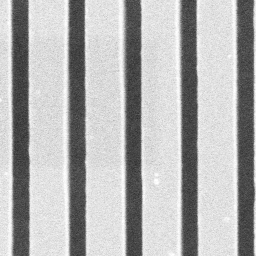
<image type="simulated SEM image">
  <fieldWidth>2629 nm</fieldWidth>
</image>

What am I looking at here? lines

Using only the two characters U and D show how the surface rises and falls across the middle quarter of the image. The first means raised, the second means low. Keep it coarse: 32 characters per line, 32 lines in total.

UDDDDUUUUUUUUUUDDDDDUUUUUUUUUDDD
UDDDDUUUUUUUUUUDDDDDUUUUUUUUUDDD
UDDDDUUUUUUUUUUDDDDDUUUUUUUUUDDD
UDDDDUUUUUUUUUUDDDDDUUUUUUUUUDDD
UDDDDUUUUUUUUUUDDDDDUUUUUUUUUDDD
UDDDDUUUUUUUUUUDDDDDUUUUUUUUUDDD
UDDDDUUUUUUUUUUDDDDDUUUUUUUUUDDD
UDDDDUUUUUUUUUUDDDDDUUUUUUUUUDDD
UDDDDUUUUUUUUUUDDDDDUUUUUUUUUDDD
UDDDDUUUUUUUUUUDDDDDUUUUUUUUUDDD
UDDDDUUUUUUUUUUDDDDDUUUUUUUUUDDD
UDDDDDUUUUUUUUUDDDDDUUUUUUUUUDDD
UDDDDUUUUUUUUUUDDDDDUUUUUUUUUDDD
UDDDDUUUUUUUUUUDDDDDUUUUUUUUUDDD
UDDDDUUUUUUUUUUDDDDDUUUUUUUUUDDD
UDDDDUUUUUUUUUUDDDDDUUUUUUUUUDDD
UDDDDUUUUUUUUUUDDDDDUUUUUUUUUDDD
UDDDDUUUUUUUUUUDDDDDUUUUUUUUUDDD
UDDDDUUUUUUUUUUDDDDDUUUUUUUUUDDD
UDDDDDUUUUUUUUUDDDDDUUUUUUUUUDDD
UDDDDUUUUUUUUUUDDDDDUUUUUUUUUDDD
UDDDDDUUUUUUUUUDDDDDUUUUUUUUUDDD
UDDDDDUUUUUUUUUDDDDDUUUUUUUUUDDD
UDDDDUUUUUUUUUUDDDDDUUUUUUUUUDDD
UDDDDUUUUUUUUUUDDDDDUUUUUUUUUDDD
UDDDDUUUUUUUUUUDDDDDUUUUUUUUUDDD
UDDDDDUUUUUUUUUDDDDDUUUUUUUUUDDD
UDDDDDUUUUUUUUUDDDDDUUUUUUUUUDDD
UDDDDDUUUUUUUUUDDDDDUUUUUUUUUDDD
UDDDDDUUUUUUUUUDDDDDUUUUUUUUUDDD
UDDDDDUUUUUUUUUDDDDDUUUUUUUUUDDD
UDDDDUUUUUUUUUUDDDDDUUUUUUUUUDDD